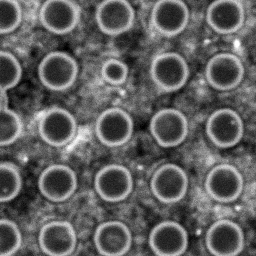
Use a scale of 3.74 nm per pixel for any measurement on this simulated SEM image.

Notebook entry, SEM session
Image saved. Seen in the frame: a regular array of raised bodies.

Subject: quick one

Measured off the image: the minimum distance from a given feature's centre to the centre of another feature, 206 nm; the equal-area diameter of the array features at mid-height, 130 nm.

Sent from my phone